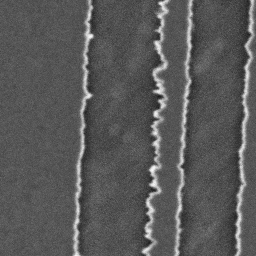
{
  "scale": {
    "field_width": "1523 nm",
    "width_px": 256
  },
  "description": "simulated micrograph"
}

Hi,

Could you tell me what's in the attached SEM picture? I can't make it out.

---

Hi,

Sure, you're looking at one or a few lines or trenches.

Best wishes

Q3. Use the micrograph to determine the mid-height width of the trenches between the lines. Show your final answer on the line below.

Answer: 64.3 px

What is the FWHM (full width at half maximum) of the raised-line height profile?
172 nm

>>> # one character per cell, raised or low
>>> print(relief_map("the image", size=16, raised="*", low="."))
******....**....
******....**....
******....**....
*****.....**....
*****.....**...*
*****.....**...*
*****.....**...*
*****.....**...*
*****.....*....*
*****.....*....*
*****.....*....*
*****.....*....*
*****....**....*
*****....**....*
*****....**....*
*****....**....*